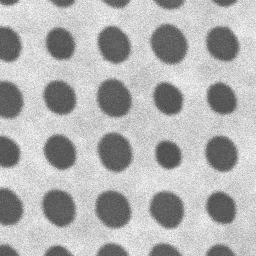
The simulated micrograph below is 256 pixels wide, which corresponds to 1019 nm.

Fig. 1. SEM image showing a regular array of holes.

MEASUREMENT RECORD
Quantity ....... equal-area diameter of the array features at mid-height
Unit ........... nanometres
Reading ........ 137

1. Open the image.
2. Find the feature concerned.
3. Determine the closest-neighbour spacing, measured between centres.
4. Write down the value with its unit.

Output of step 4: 214 nanometres